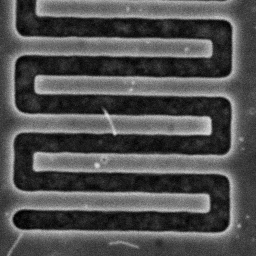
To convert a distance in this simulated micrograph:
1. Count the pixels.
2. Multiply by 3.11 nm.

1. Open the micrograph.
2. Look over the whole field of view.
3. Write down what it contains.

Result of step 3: groups of lines, slits or small figures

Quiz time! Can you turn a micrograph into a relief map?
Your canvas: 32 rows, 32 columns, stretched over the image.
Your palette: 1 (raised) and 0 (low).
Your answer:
11000111111111111111111111111111
11000111111111111111111111111111
11000000000000000000000000001111
11000000000000000000000000000111
11100000000000000000000000000111
11111111111111111111111111000111
11111111111111111111111111000111
11000000000000000000000000000111
11000000000000000000000000000111
11000100000000000000000000001111
11001111111111111111111111111111
11000111111111111111111111111111
11000000000000000000000000000111
11000000000000000000000000000111
11111111111111110011100000000111
11111111111111111111111111000111
11111111111111111111111111000111
11000000000000000000000000000111
11000000000000000000000000000111
11001111111111111111111111111111
11001111111111111111111111111111
11000000000001011111111111111111
11000000000000000000000000000111
11000000000000000000000000000111
11111111111111111111111111000111
11111111111111111111111111000111
11000000000000000000000001000111
11000000000000000000000000000111
11000000000000000000000000001111
11111111111111111111111111111111
11111111111111111111111111111111
11111111111111111111111111111111